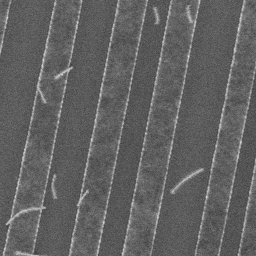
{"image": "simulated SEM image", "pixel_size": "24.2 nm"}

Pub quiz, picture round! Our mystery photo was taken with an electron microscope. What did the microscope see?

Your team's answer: lines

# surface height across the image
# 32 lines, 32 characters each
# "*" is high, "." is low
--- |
*......***.....***...****.....**
*......***.....***...****.....**
*.....****....****...***......**
*.....****....****...***......**
......***.....****..****......**
......***.....***...****.....***
......***....****...****.....***
.....****....****...****.....***
.....****....****...***......***
.....***.....****...***......***
.....***.....***...****.....****
.....***.....***...****.....***.
....****....****...****.....***.
....****....****...***......***.
....***.....****...***......***.
....***.....***...****.....****.
....***.....***...****.....***..
...****....****...****.....***..
...****....****...***......***..
...***.....****...***......***..
...***.....***...****......***..
..****.....***...****.....***...
..****....****...****.....***..*
..****....****...***......***..*
..****....****...***......***..*
..***.....***....***......***..*
..***.....***...****.....***...*
.****....****...****.....***...*
.****....****...****.....***..**
.****....****...***......***..**
.***.....***....***......***..**
****.....***...****.....***...**